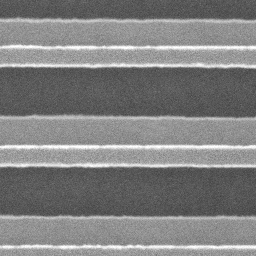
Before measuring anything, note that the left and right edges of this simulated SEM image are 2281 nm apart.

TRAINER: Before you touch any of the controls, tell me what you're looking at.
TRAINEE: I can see lines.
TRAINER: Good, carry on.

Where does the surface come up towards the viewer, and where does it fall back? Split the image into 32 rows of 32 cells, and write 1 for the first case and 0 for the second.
00000000000000000000000000000000
00000000000000000000000000000000
00000000000000000000000000000000
11111111111111111111111111111111
11111111111111111111111111111111
11111111111111111111111111111111
11111111111111111111111111111111
11111111111111111111111111111111
00000000000000000000000000000000
00000000000000000000000000000000
00000000000000000000000000000000
00000000000000000000000000000000
00000000000000000000000000000000
00000000000000000000000000000000
00000000000000000000000000000000
11111111111111111111111111111111
11111111111111111111111111111111
11111111111111111111111111111111
11111111111111111111111111111111
11111111111111111111111111111111
11111111111111111111111111111111
00000000000000000000000000000000
00000000000000000000000000000000
00000000000000000000000000000000
00000000000000000000000000000000
00000000000000000000000000000000
00000000000000000000000000000000
11111111111111111111111111111111
11111111111111111111111111111111
11111111111111111111111111111111
11111111111111111111111111111111
11111111111111111111111111111111